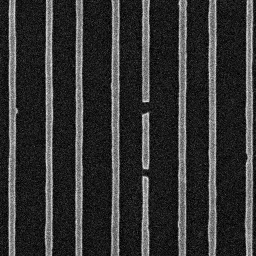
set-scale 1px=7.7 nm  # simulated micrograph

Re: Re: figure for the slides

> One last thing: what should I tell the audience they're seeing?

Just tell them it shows parallel lines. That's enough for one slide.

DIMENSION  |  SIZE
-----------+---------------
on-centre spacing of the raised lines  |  0.261 um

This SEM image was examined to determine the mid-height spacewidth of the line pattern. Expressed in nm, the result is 228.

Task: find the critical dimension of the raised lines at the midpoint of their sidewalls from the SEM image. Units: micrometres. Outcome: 0.05